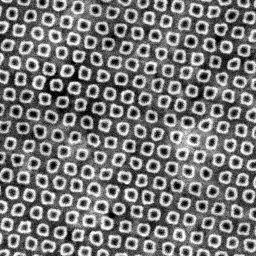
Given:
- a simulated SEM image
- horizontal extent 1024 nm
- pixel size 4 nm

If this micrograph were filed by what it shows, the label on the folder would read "a regular array of raised bodies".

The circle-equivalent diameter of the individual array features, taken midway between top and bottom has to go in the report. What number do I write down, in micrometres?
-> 0.049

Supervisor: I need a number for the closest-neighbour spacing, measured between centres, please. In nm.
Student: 69.9